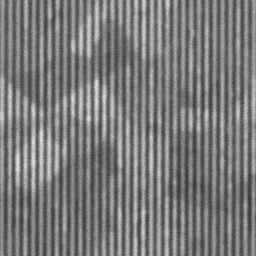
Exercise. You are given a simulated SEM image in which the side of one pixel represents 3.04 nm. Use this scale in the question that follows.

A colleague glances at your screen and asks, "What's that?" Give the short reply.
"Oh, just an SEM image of parallel lines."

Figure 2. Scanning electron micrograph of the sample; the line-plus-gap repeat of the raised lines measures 23.9 nanometres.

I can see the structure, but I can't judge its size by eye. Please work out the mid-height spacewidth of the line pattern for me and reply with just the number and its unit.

5.26 pixels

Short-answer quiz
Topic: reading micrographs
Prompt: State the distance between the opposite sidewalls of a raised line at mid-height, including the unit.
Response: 8 nanometres